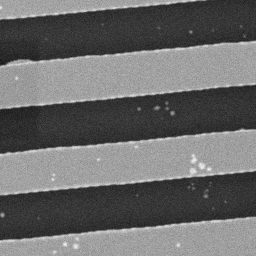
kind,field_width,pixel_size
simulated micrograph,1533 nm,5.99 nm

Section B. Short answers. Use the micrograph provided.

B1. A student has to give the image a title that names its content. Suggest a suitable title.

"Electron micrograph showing lines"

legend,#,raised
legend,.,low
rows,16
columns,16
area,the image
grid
########........
................
................
......##########
################
#############...
###.............
................
............####
.###############
################
#######.........
................
................
......##########
################